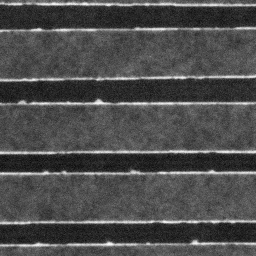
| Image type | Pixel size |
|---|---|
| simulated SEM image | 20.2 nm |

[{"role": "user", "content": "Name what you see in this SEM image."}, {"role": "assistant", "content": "lines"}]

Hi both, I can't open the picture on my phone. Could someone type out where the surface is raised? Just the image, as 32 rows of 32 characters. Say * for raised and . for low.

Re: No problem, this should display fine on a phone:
***.****************************
................................
................................
................................
********************************
********************************
********************************
********************************
********************************
********************************
................................
................................
................................
********************************
********************************
********************************
********************************
********************************
********************************
................................
................................
................................
********************************
********************************
********************************
********************************
********************************
********************************
................................
................................
........................********
********************************